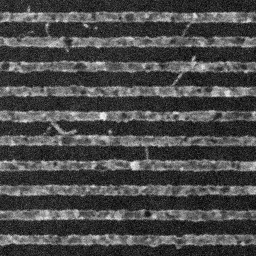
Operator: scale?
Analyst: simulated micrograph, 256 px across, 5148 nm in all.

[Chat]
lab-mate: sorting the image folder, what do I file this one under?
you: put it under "parallel lines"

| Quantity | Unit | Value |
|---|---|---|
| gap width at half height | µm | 0.334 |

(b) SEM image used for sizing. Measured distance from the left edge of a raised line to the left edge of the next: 24.7 px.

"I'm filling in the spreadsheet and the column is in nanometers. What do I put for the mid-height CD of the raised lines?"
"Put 166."